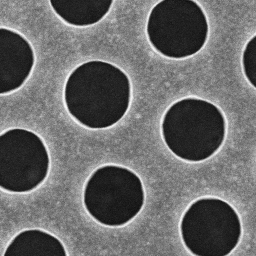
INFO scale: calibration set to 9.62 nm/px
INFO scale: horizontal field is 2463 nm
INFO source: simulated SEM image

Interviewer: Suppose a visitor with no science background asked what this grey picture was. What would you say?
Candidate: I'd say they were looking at holes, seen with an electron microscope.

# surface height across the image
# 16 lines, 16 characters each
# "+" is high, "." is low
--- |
+++....+++...+++
++++..+++....+++
..+++++++....+++
..++++++++..+++.
..+++...+++++++.
.+++....++++++++
++++....+++..+++
+++++..+++....++
..++++++++....++
...++++++++..+++
...+++..++++++++
..+++....+++++++
+++++....+++..++
++++++..+++....+
+..++++++++....+
....++++++++...+